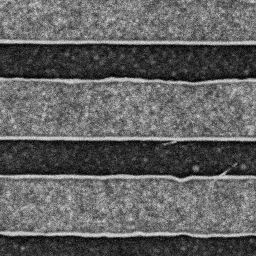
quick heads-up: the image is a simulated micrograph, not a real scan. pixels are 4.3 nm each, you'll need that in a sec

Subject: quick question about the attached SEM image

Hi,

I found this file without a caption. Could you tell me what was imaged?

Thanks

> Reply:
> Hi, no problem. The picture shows one or a few lines or trenches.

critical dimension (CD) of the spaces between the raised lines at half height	158	nanometers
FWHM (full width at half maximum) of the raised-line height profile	254	nm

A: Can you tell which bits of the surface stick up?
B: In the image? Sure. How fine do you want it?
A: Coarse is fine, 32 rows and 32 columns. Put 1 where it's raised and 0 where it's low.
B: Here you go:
11111111111111111111111111111111
11111111111111111111111111111111
11111111111111111111111111111111
11111111111111111111111111111111
11111111111111111111111111111111
00000000000000000000000000000000
00000000000000000000000000000000
00000000000000000000000000000000
00000000000000000000000000000000
00000000000000000000000000000000
11111111111111111111111111111111
11111111111111111111111111111111
11111111111111111111111111111111
11111111111111111111111111111111
11111111111111111111111111111111
11111111111111111111111111111111
11111111111111111111111111111111
00000000000000000000000000000000
00000000000000000000000000000000
00000000000000000000000000000000
00000000000000000000000000000000
00000000000000000000000000000000
11111111111111111111111111111111
11111111111111111111111111111111
11111111111111111111111111111111
11111111111111111111111111111111
11111111111111111111111111111111
11111111111111111111111111111111
11111111111111111111111111111111
00000000000000000000000001100000
00000000000000000000000000000000
00000000000000000000000000000000